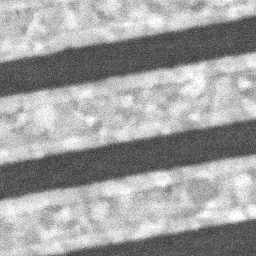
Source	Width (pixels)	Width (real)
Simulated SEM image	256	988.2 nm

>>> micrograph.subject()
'one or a few lines or trenches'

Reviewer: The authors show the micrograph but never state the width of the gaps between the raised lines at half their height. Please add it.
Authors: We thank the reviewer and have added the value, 185 nanometers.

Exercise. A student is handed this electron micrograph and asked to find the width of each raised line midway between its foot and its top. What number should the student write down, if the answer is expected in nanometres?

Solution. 199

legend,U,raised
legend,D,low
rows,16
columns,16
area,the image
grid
UUUUUUUUUUUUUUUU
UUUUUUUUUUUDDDDD
UUUUUDDDDDDDDDDD
DDDDDDDDDDDDDDDD
DDDDDDDDDDDUUUUU
DDDDDDUUUUUUUUUU
UUUUUUUUUUUUUUUU
UUUUUUUUUUUUUDDD
UUUUUUUUDDDDDDDD
UUDDDDDDDDDDDDDD
DDDDDDDDDDDDDUUU
DDDDDDDDUUUUUUUU
DDUUUUUUUUUUUUUU
UUUUUUUUUUUUUUDD
UUUUUUUUUDDDDDDD
UUUUDDDDDDDDDDDD